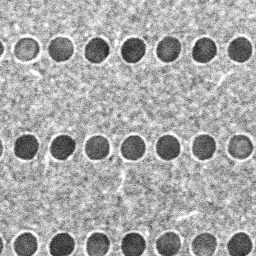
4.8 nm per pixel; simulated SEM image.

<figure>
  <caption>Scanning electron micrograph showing a regular array of holes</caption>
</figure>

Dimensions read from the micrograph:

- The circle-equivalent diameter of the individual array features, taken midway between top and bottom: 0.13 um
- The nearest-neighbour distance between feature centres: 170 nm